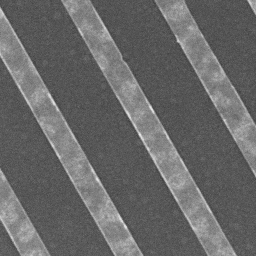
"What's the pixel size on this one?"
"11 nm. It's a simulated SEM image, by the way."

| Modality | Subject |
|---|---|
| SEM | one or a few lines or trenches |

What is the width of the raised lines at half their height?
0.262 microns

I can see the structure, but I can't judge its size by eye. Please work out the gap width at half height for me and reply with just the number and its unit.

627 nm